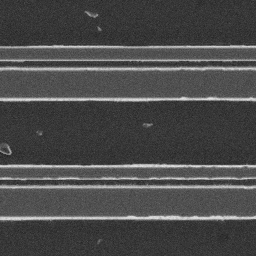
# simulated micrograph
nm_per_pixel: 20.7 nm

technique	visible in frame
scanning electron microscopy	lines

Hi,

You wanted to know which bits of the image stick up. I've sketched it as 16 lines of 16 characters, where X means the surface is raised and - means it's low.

----------------
----------------
----------------
XXXXXXXXXXXXXXXX
XXXXXXXXXXXXXXXX
XXXXXXXXXXXXXXXX
----------------
----------------
----------------
----------------
XXXXXXXXXXXXXXXX
XXXXXXXXXXXXXXXX
XXXXXXXXXXXXXXXX
XXXXXXXXXXXXXXXX
----------------
----------------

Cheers